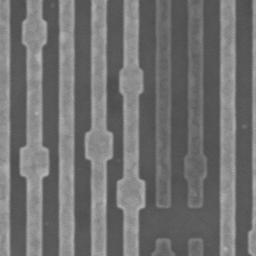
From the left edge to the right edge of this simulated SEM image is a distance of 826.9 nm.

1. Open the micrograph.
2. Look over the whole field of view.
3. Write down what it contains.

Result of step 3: wiring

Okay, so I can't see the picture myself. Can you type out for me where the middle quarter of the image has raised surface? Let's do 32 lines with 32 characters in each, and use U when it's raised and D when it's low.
UUDDDDDUUUDDDDDUUUUDDDDUUUUDDDDU
UUDDDDDUUUDDDDUUUUUDDDDUUUUDDDDU
UUDDDDDUUUDDDDUUUUUUDDDUUUUDDDDU
UUDDDDDUUUDDDDUUUUUUDDDUUUUDDDDU
UUDDDDDUUUDDDDUUUUUUDDDUUUUDDDDU
UUDDDDDUUUDDDDUUUUUUDDDUUUUDDDDU
UUDDDDDUUUDDDDUUUUUUDDDUUUUDDDDU
UUDDDDDUUUDDDDDUUUUDDDDUUUUDDDDU
UUDDDDDUUUDDDDDUUUUDDDDUUUUDDDDU
UUDDDDDUUUDDDDDUUUUDDDDUUUUDDDDU
UUDDDDDUUUDDDDDUUUUDDDDUUUUDDDDU
UUDDDDDUUUDDDDDUUUUDDDDUUUUDDDDU
UUDDDDDUUUDDDDDUUUUDDDDUUUUDDDDU
UUDDDDDUUUDDDDDUUUUDDDDUUUUDDDDU
UUDDDDDUUUDDDDDUUUUDDDDUUUUDDDDU
UUDDDDDUUUDDDDDUUUUDDDDUUUUDDDDU
UUDDDDDUUUUDDDDUUUUDDDDUUUUDDDDU
UUDDDUUUUUUUDDDUUUUDDDDUUUUDDDDU
UUDDDUUUUUUUDDDUUUUDDDDUUUUDDDDU
UUDDDUUUUUUUDDDUUUUDDDDUUUUDDDDU
UUDDDUUUUUUUDDDUUUUDDDDUUUUDDDDU
UUDDDUUUUUUUDDDUUUUDDDDUUUUDDDDU
UUDDDUUUUUUUDDDUUUUDDDDUUUUDDDDU
UUDDDUUUUUUUDDDUUUUDDDDUUUUDDDUU
UUDDDDDUUUUDDDDUUUUDDDDUUUUDDDUU
UUDDDDDUUUDDDDDUUUUDDDDUUUUDDDUU
UUDDDDDUUUDDDDDUUUUDDDDUUUUDDDUU
UUDDDDDUUUDDDDDUUUUDDDDUUUUDDDUU
UUDDDDDUUUDDDDDUUUUDDDDUUUUDDDUU
UUDDDDDUUUDDDUUUUUUUDDDUUUUDDDDU
UUDDDDDUUUDDDUUUUUUUDDDUUUUDDDDU
UUDDDDDUUUDDDUUUUUUUDDDUUUUDDDDU